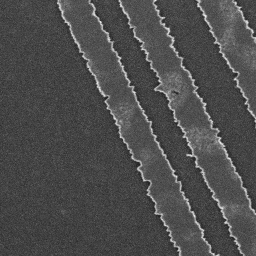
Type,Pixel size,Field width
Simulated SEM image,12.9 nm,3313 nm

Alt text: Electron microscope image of one or a few lines or trenches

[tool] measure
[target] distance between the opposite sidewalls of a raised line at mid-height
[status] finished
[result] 382 nm